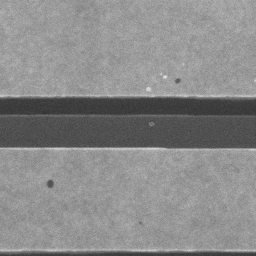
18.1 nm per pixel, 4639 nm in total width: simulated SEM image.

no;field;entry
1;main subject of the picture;lines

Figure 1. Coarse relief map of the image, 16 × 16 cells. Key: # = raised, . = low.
################
################
################
################
################
################
................
................
................
################
################
################
################
################
################
################